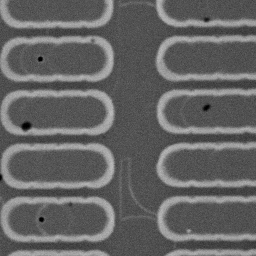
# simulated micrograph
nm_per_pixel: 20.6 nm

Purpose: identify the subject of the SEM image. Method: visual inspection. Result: wiring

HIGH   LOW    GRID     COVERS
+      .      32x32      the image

++++++++++++++......++++++++++++
.+++++++++++++......++++++++++++
.++++++++++++........+++++++++++
................................
................................
.++++++++++++........+++++++++++
.+++++++++++++......++++++++++++
++++++++++++++......++++++++++++
.+++++++++++++......++++++++++++
..+++++++++++........+++++++++++
................................
................................
.++++++++++++........+++++++++++
.+++++++++++++......++++++++++++
.+++++++++++++......++++++++++++
.++++++++++++........+++++++++++
..+++++.........................
................................
..++++++++++..........++++++++++
.+++++++++++++......++++++++++++
.+++++++++++++......++++++++++++
.+++++++++++++......++++++++++++
.++++++++++++........+++++++++++
................................
................................
.++++++++++++........+++++++++++
.+++++++++++++......++++++++++++
.+++++++++++++......++++++++++++
.+++++++++++++......++++++++++++
..+++++++++++........+++++++++++
................................
................................